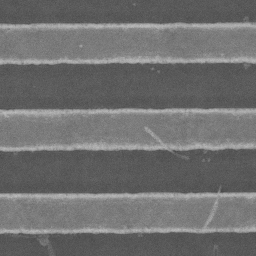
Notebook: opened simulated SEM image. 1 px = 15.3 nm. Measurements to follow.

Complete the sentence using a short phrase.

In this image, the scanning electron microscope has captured lines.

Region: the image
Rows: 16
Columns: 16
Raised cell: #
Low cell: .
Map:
................
...........#..##
################
################
................
................
................
################
################
................
................
................
################
################
###########.#...
................